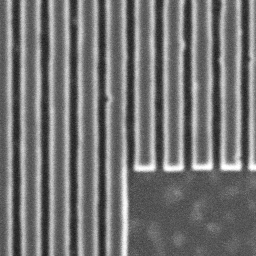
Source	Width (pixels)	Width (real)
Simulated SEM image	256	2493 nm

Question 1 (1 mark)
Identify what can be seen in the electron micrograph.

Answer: parallel lines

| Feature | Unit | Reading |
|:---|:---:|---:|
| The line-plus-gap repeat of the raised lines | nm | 278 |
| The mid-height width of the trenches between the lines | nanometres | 114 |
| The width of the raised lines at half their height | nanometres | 164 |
